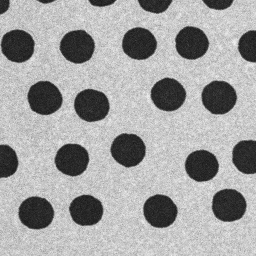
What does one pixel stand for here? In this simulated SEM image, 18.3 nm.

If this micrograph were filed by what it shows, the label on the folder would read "a regular array of holes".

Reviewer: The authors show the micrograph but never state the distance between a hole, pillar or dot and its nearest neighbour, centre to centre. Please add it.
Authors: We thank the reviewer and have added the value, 0.932 um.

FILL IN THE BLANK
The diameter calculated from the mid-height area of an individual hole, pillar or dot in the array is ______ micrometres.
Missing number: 0.633